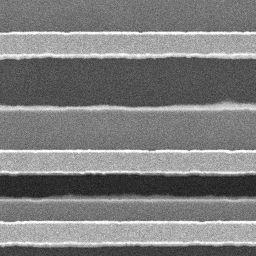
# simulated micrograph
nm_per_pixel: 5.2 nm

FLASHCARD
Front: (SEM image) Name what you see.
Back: lines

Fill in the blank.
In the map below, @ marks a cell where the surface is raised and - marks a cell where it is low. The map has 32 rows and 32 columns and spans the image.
@@@@@@@@@@@@@@@@@@@@@@@@@@@@@@@@
@@@@@@@@@@@@@@@@@@@@@@@@@@@@@@@@
@@@@@@@@@@@@@@@@@@@@@@@@@@@@@@@@
@@@@@@@@@@@@@@@@@@@@@@@@@@@@@@@@
@@@@@@@@@@@@@@@@@@@@@@@@@@@@@@@@
@@@@@@@@@@@@@@@@@@@@@@@@@@@@@@@@
@@@@@@@@@@@@@@@@@@@@@@@@@@@@@@@@
--------------------------------
--------------------------------
--------------------------------
--------------------------------
--------------------------------
--------------------------------
--------------------------------
@@@@@@@@@@@@@@@@@@@@@@@@@@@@@@@@
@@@@@@@@@@@@@@@@@@@@@@@@@@@@@@@@
@@@@@@@@@@@@@@@@@@@@@@@@@@@@@@@@
@@@@@@@@@@@@@@@@@@@@@@@@@@@@@@@@
@@@@@@@@@@@@@@@@@@@@@@@@@@@@@@@@
@@@@@@@@@@@@@@@@@@@@@@@@@@@@@@@@
@@@@@@@@@@@@@@@@@@@@@@@@@@@@@@@@
@@@@@@@@@@@@@@@@@@@@@@@@@@@@@@@@
--------------------------------
--------------------------------
--------------------------------
@@@@@@@@@@@@@@@@@@@@@@@@@@@@@@@@
@@@@@@@@@@@@@@@@@@@@@@@@@@@@@@@@
@@@@@@@@@@@@@@@@@@@@@@@@@@@@@@@@
@@@@@@@@@@@@@@@@@@@@@@@@@@@@@@@@
@@@@@@@@@@@@@@@@@@@@@@@@@@@@@@@@
@@@@@@@@@@@@@@@@@@@@@@@@-@@@-@-@
--------------------------------